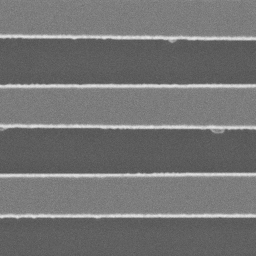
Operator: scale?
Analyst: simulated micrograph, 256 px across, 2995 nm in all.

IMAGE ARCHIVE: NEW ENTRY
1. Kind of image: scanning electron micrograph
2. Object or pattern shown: lines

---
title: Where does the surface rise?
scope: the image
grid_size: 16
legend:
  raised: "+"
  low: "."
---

++++++++++++++++
++++++++++++++++
................
................
................
++++++++++++++++
++++++++++++++++
++++++++++++++++
................
................
................
++++++++++++++++
++++++++++++++++
++++++++++++++++
................
................